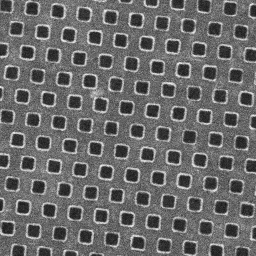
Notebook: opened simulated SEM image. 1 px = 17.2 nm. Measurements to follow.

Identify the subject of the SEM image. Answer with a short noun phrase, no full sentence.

a regular array of raised bodies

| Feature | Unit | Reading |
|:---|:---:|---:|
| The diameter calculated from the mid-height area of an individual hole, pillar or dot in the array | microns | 0.268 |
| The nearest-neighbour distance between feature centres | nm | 436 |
